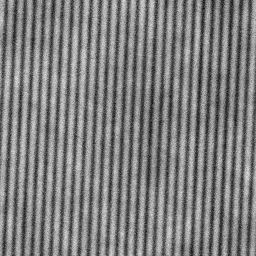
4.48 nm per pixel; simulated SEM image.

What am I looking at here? parallel lines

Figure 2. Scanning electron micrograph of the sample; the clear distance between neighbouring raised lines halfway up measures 16.8 nanometers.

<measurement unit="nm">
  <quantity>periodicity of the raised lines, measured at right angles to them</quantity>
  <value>42.1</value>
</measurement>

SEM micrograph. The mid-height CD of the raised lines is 0.0252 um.